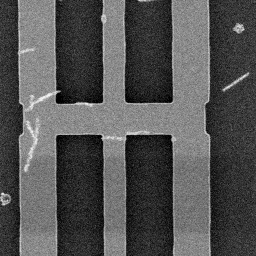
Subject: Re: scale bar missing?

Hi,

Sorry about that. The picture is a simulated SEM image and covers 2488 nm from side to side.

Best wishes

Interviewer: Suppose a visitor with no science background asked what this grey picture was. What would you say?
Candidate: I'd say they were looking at groups of lines, slits or small figures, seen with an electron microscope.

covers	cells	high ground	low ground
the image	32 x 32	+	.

..+++++......++.......++++......
..+++++......++.......++++......
..+++++......++.......++++......
..+++++......++.......++++......
..+++++......+++......++++......
..+++++......+++......++++......
..+++++......+++......++++......
..+++++......+++......++++......
..+++++......+++......++++......
..+++++......++.......++++......
..+++++......++.......++++......
..+++++......++.......++++......
...++++......+++......++++......
...+++++++++++++++++++++++......
...+++++++++++++++++++++++......
...+++++++++++++++++++++++......
...+++++++++++++++++++++++......
..+++++......+++.....+++++......
..+++++......+++......++++......
...++++......+++......++++......
...++++......+++......++++......
...++++......+++......++++......
...++++......+++......++++......
...++++......+++......++++......
...++++......+++......++++......
...++++......+++......++++......
...++++......+++......++++......
...++++......+++......++++......
...++++......+++......++++......
...++++......+++......++++......
...++++......+++......++++......
...++++......+++......++++......